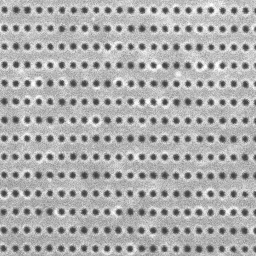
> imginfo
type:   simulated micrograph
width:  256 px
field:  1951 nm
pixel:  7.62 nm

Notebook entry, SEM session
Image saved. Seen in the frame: a regular array of holes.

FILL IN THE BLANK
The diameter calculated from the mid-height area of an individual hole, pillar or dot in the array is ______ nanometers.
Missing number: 57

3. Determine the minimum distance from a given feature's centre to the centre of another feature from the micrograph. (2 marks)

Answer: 11.2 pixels